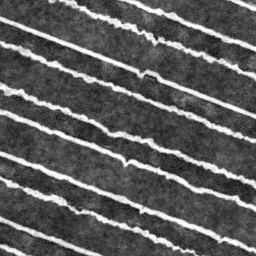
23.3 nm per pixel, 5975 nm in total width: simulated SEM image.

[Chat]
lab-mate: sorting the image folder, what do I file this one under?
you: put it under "one or a few lines or trenches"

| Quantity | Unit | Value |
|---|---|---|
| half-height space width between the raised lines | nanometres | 553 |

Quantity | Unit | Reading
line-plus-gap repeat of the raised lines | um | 1.46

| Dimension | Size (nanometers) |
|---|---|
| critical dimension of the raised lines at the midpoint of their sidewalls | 910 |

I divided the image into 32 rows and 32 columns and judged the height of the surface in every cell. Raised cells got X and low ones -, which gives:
XXXXXXXXX--------XXXXXXXXXXXXX--
XXXXXXXXXXX---------XXXXXXXXXXXX
-XXXXXXXXXXXXX---------XXXXXXXXX
---XXXXXXXXXXXXX---------XXXXXXX
------XXXXXXXXXXXXX---------XXXX
--------XXXXXXXXXXXXX---------XX
XXX--------XXXXXXXXXXXXX--------
XXXXX---------XXXXXXXXXXXXX-----
XXXXXXXX--------XXXXXXXXXXXXXX--
XXXXXXXXXX----------XXXXXXXXXXXX
XXXXXXXXXXXXX---------XXXXXXXXXX
--XXXXXXXXXXXXXX--------XXXXXXXX
----XXXXXXXXXXXXXX---------XXXXX
--------XXXXXXXXXXXXX--------XXX
XX--------XXXXXXXXXXXXXX--------
XXXX--------XXXXXXXXXXXXXX------
XXXXXX--------XXXXXXXXXXXXXX----
XXXXXXXXX---------XXXXXXXXXXXXX-
XXXXXXXXXXXX--------XXXXXXXXXXXX
-XXXXXXXXXXXXX---------XXXXXXXXX
----XXXXXXXXXXXXX--------XXXXXXX
------XXXXXXXXXXXXXX--------XXXX
---------XXXXXXXXXXXXX---------X
XXX---------XXXXXXXXXXXX--------
XXXXX---------XXXXXXXXXXXXX-----
XXXXXXXX---------XXXXXXXXXXXXX--
XXXXXXXXXX---------XXXXXXXXXXXXX
-XXXXXXXXXXXX---------XXXXXXXXXX
---XXXXXXXXXXXXX---------XXXXXXX
-----XXXXXXXXXXXXXX--------XXXXX
--------XXXXXXXXXXXXX---------XX
XX---------XXXXXXXXXXXXX--------